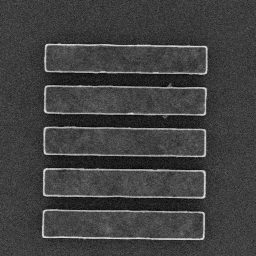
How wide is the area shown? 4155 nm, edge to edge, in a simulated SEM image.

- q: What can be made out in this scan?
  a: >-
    groups of lines, slits or small figures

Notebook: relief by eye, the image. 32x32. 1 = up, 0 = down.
00000000000000000000000000000000
00000000000000000000000000000000
00000000000000000000000000000000
00000000000000000000000000000000
00000000000000000000000000000000
00000000000000000000000000000000
00000011111111111111111111000000
00000011111111111111111111000000
00000011111111111111111111000000
00000000000000000000000000000000
00000000000000000000000000000000
00000011111111111111111111000000
00000011111111111111111111000000
00000011111111111111111111000000
00000000000000000000000000000000
00000000000000000000000000000000
00000011111111111111111110000000
00000011111111111111111111000000
00000011111111111111111111000000
00000000000000000000001110000000
00000000000000000000000000000000
00000011111111111111111110000000
00000011111111111111111111000000
00000011111111111111111111000000
00000001111111111111111110000000
00000000000000000000000000000000
00000011111111110000000000000000
00000111111111111111111110000000
00000111111111111111111110000000
00000011111111111111111110000000
00000000000000000000000000000000
00000000000000000000000000000000